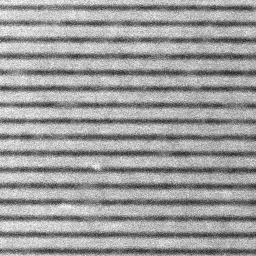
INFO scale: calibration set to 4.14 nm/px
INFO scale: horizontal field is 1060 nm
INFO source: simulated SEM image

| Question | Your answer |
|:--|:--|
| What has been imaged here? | parallel lines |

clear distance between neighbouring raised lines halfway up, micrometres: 0.0279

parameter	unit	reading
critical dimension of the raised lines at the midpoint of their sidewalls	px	9.64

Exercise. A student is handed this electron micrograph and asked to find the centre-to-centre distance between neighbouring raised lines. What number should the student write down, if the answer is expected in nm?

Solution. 67.2